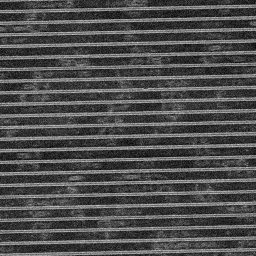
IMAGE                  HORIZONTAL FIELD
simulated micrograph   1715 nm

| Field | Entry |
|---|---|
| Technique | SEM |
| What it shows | parallel lines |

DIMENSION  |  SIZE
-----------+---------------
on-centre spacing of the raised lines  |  77.6 nanometres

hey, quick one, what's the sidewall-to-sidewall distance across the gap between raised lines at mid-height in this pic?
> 65.3 nanometers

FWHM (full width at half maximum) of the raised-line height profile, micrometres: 0.0126